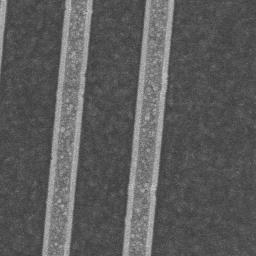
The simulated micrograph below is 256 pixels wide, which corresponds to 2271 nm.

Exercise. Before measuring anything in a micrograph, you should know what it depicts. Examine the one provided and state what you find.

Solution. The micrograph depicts one or a few lines or trenches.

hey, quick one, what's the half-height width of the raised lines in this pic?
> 214 nanometers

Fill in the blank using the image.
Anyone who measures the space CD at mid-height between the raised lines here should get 57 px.